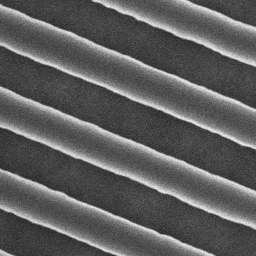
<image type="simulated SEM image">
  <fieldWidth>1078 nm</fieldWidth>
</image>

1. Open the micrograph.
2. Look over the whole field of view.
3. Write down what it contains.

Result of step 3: lines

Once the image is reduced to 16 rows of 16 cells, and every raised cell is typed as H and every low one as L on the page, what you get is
LLLLLLLHHHHHHLLL
HHHLLLLLLHHHHHHL
HHHHHLLLLLLLHHHH
LLHHHHHHLLLLLLHH
LLLLHHHHHHLLLLLL
LLLLLLLHHHHHHLLL
HHLLLLLLLHHHHHHL
HHHHHLLLLLLLHHHH
LLHHHHHLLLLLLLHH
LLLLHHHHHHLLLLLL
LLLLLLHHHHHHLLLL
HHLLLLLLLHHHHHHL
HHHHHLLLLLLHHHHH
LHHHHHHLLLLLLLHH
LLLLHHHHHHLLLLLL
LLLLLLHHHHHHLLLL